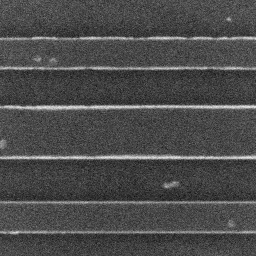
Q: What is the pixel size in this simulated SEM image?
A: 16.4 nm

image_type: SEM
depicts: lines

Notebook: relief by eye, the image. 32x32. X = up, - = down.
--------------------------------
--------------------------------
--------------------------------
--------------------------------
--------------------------------
XXXXXXXXXXXXXXXXXXXXXXXXXXXXXXXX
XXXXXXXXXXXXXXXXXXXXXXXXXXXXXXXX
XXXXXXXXXXXXXXXXXXXXXXXXXXXXXXXX
XXXX-XXXXXXXXXXXXXXXXXXXXXXXXXXX
--------------------------------
--------------------------------
--------------------------------
--------------------------------
XXXXXX-XXXXXXXXXXXXXXXXXXXXXXXXX
XXXXXXXXXXXXXXXXXXXXXXXXXXXXXXXX
XXXXXXXXXXXXXXXXXXXXXXXXXXXXXXXX
XXXXXXXXXXXXXXXXXXXXXXXXXXXXXXXX
XXXXXXXXXXXXXXXXXXXXXXXXXXXXXXXX
XXXXXXXXXXXXXXXXXXXXXXXXXXXXXXXX
XXXXXXXXXXXXXXXXXXXXXXXXXXXXXXXX
--------------------------------
--------------------------------
--------------------------------
--------------------------------
--------------------------------
XXXXXXXXXXXXXXXXXXXXXXXXXXXXXXXX
XXXXXXXXXXXXXXXXXXXXXXXXXXXXXXXX
XXXXXXXXXXXXXXXXXXXXXXXXXXXXXXXX
XXXXXXXXXXXXXXXXXXXXXXXXXXXXXXXX
--------------------------------
--------------------------------
--------------------------------